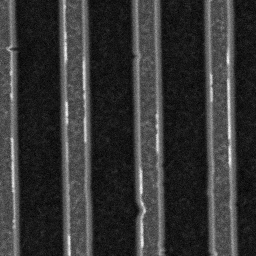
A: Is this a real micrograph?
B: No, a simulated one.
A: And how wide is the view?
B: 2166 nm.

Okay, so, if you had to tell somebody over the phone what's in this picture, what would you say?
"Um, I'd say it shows one or a few lines or trenches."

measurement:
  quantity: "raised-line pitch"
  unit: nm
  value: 613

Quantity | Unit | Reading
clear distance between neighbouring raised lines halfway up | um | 0.423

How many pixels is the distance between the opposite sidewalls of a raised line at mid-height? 23